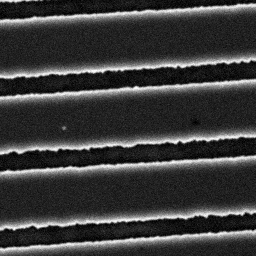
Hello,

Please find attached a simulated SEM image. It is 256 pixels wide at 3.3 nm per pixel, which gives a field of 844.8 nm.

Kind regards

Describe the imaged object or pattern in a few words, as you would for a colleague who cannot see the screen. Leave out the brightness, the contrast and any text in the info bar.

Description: lines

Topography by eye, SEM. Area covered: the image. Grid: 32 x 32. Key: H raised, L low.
LLLLLLLLLLLLLLLLLLLLLLLLLLLLLLLH
LLLLLLLLLLLLLLLLLHHHHHHHHHHHHHHH
HHHHHHHHHHHHHHHHHHHHHHHHHHHHHHHH
HHHHHHHHHHHHHHHHHHHHHHHHHHHHHHHH
HHHHHHHHHHHHHHHHHHHHHHHHHHHHHHHH
HHHHHHHHHHHHHHHHHHHHHHHHHHHHHHHH
HHHHHHHHHHHHHHHHHHHHHHHHHHHHHHHH
HHHHHHHHHHHHHHHHHHHHHHHHHHHHHHHH
HHHHHHHHHHHHHHHHHHHHLLLLLLLLLLLL
HHHHHLLLLLLLLLLLLLLLLLLLLLLLLLLL
LLLLLLLLLLLLLLLLLLLLLLLLLHHHHHHH
LLLLLLLLLLHHHHHHHHHHHHHHHHHHHHHH
HHHHHHHHHHHHHHHHHHHHHHHHHHHHHHHH
HHHHHHHHHHHHHHHHHHHHHHHHHHHHHHHH
HHHHHHHHHHHHHHHHHHHHHHHHHHHHHHHH
HHHHHHHHHHHHHHHHHHHHHHHHHHHHHHHH
HHHHHHHHHHHHHHHHHHHHHHHHHHHHHHHH
HHHHHHHHHHHHHHHHHHHHHHHHHLLLLLLL
HHHHHHHHHHHLLLLLLLLLLLLLLLLLLLLL
LLLLLLLLLLLLLLLLLLLLLLLLLLLLLLLL
LLLLLLLLLLLLLLLLLHHHHHHHHHHHHHHH
HHHHHHHHHHHHHHHHHHHHHHHHHHHHHHHH
HHHHHHHHHHHHHHHHHHHHHHHHHHHHHHHH
HHHHHHHHHHHHHHHHHHHHHHHHHHHHHHHH
HHHHHHHHHHHHHHHHHHHHHHHHHHHHHHHH
HHHHHHHHHHHHHHHHHHHHHHHHHHHHHHHH
HHHHHHHHHHHHHHHHHHHHHHHHHHHHHHHH
HHHHHHHHHHHHHHHHHHLLLLLLLLLLLLLL
HHHLLLLLLLLLLLLLLLLLLLLLLLLLLLLL
LLLLLLLLLLLLLLLLLLLLLHHHHHHHHHHH
LLLLLLLLHHHHHHHHHHHHHHHHHHHHHHHH
HHHHHHHHHHHHHHHHHHHHHHHHHHHHHHHH